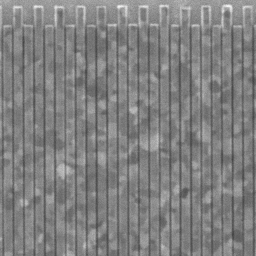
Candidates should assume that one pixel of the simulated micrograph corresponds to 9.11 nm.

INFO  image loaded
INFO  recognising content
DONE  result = parallel lines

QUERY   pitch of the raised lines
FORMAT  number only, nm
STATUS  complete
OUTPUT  95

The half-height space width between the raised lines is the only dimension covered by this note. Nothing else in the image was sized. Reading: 23.9 nm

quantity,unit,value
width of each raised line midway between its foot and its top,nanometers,72.8